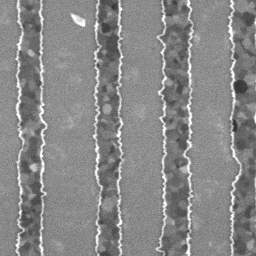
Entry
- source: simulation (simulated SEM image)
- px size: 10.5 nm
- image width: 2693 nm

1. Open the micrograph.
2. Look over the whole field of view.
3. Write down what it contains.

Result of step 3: one or a few lines or trenches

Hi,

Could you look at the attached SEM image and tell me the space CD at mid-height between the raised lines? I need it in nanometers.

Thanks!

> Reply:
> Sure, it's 460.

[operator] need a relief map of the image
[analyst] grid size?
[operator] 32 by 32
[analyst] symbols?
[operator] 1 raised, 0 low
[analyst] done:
00111000000011100000111100000111
00111000000011100000111100000111
00111000010011100000111100000111
00011000000011100000011100000111
00011000000011100000111100000111
00111000000011100000111100000111
00111000000011100000111100000111
00111000000011100000111100000111
00111000000011100000111100000111
00111000000011100000011100000111
00111000000011100000111100000111
00111000000011100000111100000111
00111000000011100000111100000111
00111000000011100000011100000111
00111000000011100000111100000111
00111100000011100000111100000111
00111000000011100000111100000111
00011000000011100000011100000111
00011000000011100000011100000111
00111000000011100000011000000111
00111000000011100000111100000011
00111000000011100000111100000011
00111000000011100000011100000111
00011000000001100000111100000111
00011000000001100000111100000111
00111000000011100000011100000111
00111000000011100000011100000111
00111000000011100000011100000111
00011000000011100000111100000111
00111000000011100000111100000111
00111000000011100000111100000111
00111000000011100000111100000111